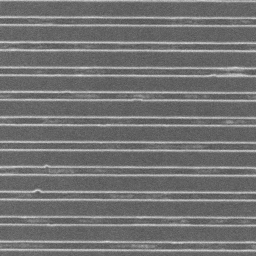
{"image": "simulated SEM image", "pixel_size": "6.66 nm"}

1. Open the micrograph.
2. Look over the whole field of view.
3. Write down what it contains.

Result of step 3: parallel lines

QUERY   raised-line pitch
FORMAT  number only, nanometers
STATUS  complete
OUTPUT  166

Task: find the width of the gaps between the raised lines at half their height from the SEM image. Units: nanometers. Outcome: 45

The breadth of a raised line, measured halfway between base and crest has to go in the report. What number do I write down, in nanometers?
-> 122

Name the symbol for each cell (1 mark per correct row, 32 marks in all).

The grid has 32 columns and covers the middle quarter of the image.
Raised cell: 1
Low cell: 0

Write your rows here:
11111111111111111111111111111111
00000000000000000000000000000000
00000000000000000000000000000000
11111111111111111111111111111111
11111111111111111111111111111111
11111111111111111111111111111111
11111111111111111111111111111111
00000000000000000000000000000000
00000000000000000000000000000000
11111111111111111111111111111111
11111111111111111111111111111111
11111111111111111111111111111111
11111111111111111111111111111111
00000000000000000000000000000000
00000000000000000000000000000000
11111111111111111111111111111111
11111111111111111111111111111111
11111111111111111111111111111111
11111111111111111111111111111111
10011110111100110000111111111111
00000000000000000000000000000000
00000000000000000000000000000000
11111111111111111111111111111111
11111111111111111111111111111111
11111111111111111111111111111111
11111111111111111111111111111111
00000000000000000000000000000000
00000000000000000000000000000000
11111111111111111111111111111111
11111111111111111111111111111111
11111111111111111111111111111111
11111111111111111111111111111111